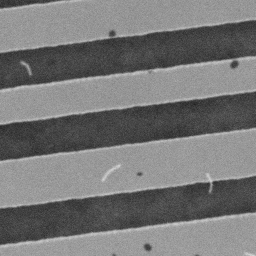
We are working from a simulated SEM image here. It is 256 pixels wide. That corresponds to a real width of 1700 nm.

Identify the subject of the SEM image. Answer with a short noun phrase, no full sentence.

lines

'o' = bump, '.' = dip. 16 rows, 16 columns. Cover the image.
oooooooooooooooo
oooooooooooooo..
oooooo..........
................
.........ooooooo
.ooooooooooooooo
oooooooooo......
oo..............
............oooo
.....ooooooooooo
oooooooooooooooo
oooooooooooo....
oooo............
..............oo
.......ooooooooo
oooooooooooooooo